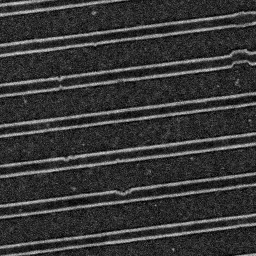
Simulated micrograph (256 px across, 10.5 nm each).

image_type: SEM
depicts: parallel lines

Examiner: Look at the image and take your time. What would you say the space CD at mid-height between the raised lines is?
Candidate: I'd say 302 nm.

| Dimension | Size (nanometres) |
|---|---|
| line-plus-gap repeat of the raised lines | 420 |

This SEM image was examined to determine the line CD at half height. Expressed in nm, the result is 113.